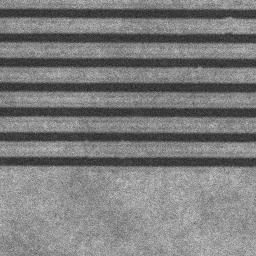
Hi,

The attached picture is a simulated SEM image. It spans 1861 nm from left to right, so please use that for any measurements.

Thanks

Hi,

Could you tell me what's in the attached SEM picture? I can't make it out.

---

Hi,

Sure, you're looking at parallel lines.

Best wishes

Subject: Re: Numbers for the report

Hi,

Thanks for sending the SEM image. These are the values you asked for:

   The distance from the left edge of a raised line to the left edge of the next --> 180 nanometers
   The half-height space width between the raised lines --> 12.1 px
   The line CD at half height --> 94.6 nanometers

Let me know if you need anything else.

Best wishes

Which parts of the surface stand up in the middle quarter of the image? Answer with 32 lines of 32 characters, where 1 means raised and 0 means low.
00000000000000000000000000000000
11111111111111111111111111111111
11111111111111111111111111111111
11111111111111111111111111111111
00000000000000000000000000000000
00000000000000000000000000000000
00000000000000000000000000000000
11111111111111111111110000000000
11111111111111111111111111111111
11111111111111111111111111111111
00000000000000000000000111111111
00000000000000000000000000000000
00000000000000000000000000000000
00000000000000000000000000000000
11111111111111111111111111111111
11111111111111111111111111111111
11111111111111111111111111111111
00000000000000000000000000000000
00000000000000000000000000000000
00000000000000000000000000000000
11111111111111111111111111111111
11111111111111111111111111111111
11111111111111111111111111111111
00000000000000000000000000000000
00000000000000000000000000000000
00000000000000000000000000000000
11111111111111111111111111111111
11111111111111111111111111111111
11111111111111111111111111111111
11111111111111111111111111111111
11111111111111111111111111111111
11111111111111111111111111111111